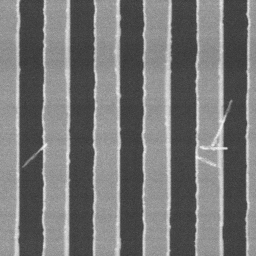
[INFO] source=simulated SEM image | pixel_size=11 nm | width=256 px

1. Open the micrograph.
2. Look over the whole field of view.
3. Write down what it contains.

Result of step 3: lines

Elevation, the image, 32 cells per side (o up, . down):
oo....ooo...ooo...ooo....ooo...o
oo...oooo...ooo...ooo....ooo...o
oo....ooo...ooo...ooo....ooo...o
oo...oooo...ooo...ooo....ooo...o
oo....ooo...ooo...ooo....ooo...o
oo...oooo...ooo...ooo....ooo...o
oo...oooo...ooo...ooo....ooo...o
oo...oooo...ooo...ooo....ooo...o
oo...oooo...ooo...ooo....ooo...o
oo....ooo...ooo...ooo....ooo...o
oo...oooo...ooo...ooo....ooo...o
oo...oooo...ooo...ooo....ooo...o
oo...oooo...ooo...ooo....ooo...o
oo...oooo...ooo...ooo....ooo...o
oo...oooo...ooo...ooo....ooo...o
oo...oooo...ooo...ooo....ooo...o
oo...oooo...ooo...ooo....ooo...o
oo...oooo...ooo...ooo....ooo...o
oo...oooo...ooo...ooo....ooo...o
oo...oooo...ooo...ooo....ooo...o
oo...oooo...ooo...ooo....ooo...o
oo...oooo...ooo...ooo....ooo...o
oo...oooo...ooo...ooo....ooo...o
oo...oooo...ooo...ooo....ooo...o
oo...oooo...ooo...ooo....ooo...o
oo...oooo...ooo...ooo....ooo...o
oo...oooo...ooo...ooo....ooo...o
oo...oooo...ooo...ooo....ooo...o
oo...oooo...ooo...ooo....ooo...o
oo...oooo...ooo...ooo....ooo...o
oo...oooo...ooo...ooo....ooo...o
oo...oooo...ooo...ooo....ooo...o